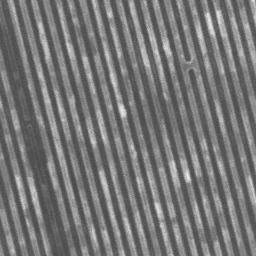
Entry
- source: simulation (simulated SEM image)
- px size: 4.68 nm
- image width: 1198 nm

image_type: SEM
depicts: parallel lines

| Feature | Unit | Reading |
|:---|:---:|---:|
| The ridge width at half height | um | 0.0239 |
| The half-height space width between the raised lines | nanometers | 31.8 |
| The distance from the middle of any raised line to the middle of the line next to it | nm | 55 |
